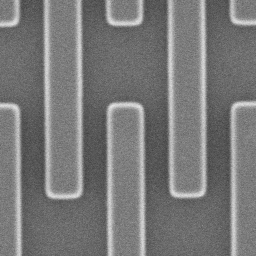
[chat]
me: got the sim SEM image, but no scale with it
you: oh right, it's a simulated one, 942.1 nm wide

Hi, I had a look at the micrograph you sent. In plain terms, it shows groups of lines, slits or small figures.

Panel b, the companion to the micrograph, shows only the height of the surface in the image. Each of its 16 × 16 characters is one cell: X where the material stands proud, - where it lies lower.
X--XX--XX--XX-XX
X--XX--X---XX---
---XX------XX---
---XX------XX---
---XX------XX---
---XX------XX---
---XX--X---XX--X
X--XX--XX--XX--X
X--XX--XX--XX--X
X--XX--XX--XX--X
X--XX--XX--XX--X
X--XX--XX--XX--X
X------XX------X
X------XX------X
X------XX------X
X------XX------X